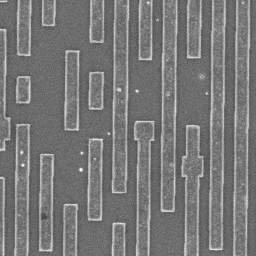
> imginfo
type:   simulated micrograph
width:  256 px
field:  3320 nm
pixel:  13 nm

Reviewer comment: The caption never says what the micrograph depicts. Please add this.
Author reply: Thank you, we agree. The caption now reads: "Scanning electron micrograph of wiring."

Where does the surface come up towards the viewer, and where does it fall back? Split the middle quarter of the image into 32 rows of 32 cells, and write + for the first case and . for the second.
.++..........+++.........+++....
.++..........+++.........+++....
.++....+++...+++.........+++....
.++....+++...+++.........+++....
.++....+++...+++.........+++....
.++....+++...+++.........+++....
.++...++++...+++.........+++....
.++...++++...+++.........+++....
.++...++++..++++.........+++....
+++...++++..++++.........+++....
+++...++++..++++.........+++....
+++.........++++.........+++....
+++.........++++.........+++....
+++.........++++.........+++....
+++.........++++..++++...+++....
+++.........++++..++++...+++...+
............++++..++++...+++...+
............++++..++++..++++...+
............++++..++++..++++...+
......++++..++++...+++..++++...+
......++++..++++...++...++++...+
......++++..++++...++...++++...+
......+++...++++...++...++++...+
......+++...++++...++...++++..++
......+++...++++...++...++++..++
......+++...++++..+++...++++..++
......+++...++++..+++...++++..++
......+++...++++..+++...++++..++
......+++...++++..+++...++++..++
......+++...++++..+++...++++...+
......+++...+++...+++...++++...+
......+++...+++...+++...++++...+